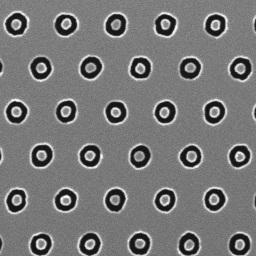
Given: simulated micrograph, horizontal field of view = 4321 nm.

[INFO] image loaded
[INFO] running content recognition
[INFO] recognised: a regular array of ring-shaped grooves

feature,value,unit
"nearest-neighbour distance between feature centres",834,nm